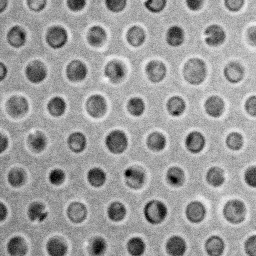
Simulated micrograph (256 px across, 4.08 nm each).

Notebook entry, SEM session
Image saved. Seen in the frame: a regular array of holes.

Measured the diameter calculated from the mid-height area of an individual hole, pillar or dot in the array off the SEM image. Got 90 nanometres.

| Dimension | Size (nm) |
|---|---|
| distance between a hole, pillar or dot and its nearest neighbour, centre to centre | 160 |